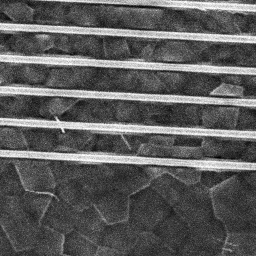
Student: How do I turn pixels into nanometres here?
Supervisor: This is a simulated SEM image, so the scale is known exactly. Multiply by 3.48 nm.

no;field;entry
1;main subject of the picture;parallel lines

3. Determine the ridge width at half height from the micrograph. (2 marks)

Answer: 20.9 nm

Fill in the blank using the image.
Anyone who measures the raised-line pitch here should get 110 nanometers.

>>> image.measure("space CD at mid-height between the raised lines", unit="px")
25.5